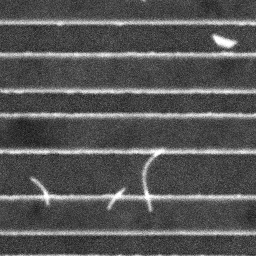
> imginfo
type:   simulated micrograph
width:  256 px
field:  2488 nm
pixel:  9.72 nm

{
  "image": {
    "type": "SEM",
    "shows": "lines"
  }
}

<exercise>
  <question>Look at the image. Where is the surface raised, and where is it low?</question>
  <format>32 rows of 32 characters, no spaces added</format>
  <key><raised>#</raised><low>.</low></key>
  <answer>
################################
################################
################################
................................
................................
................................
................................
################################
################################
################################
################################
#.#.....########################
................................
................................
################################
################################
################################
################################
################################
................................
................................
................................
................................
................................
.....##......###..#.....#....#..
################################
################################
################################
################################
................................
................................
................................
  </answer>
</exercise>